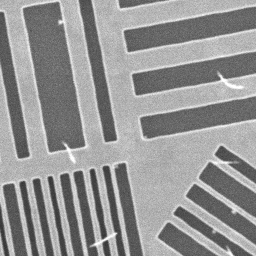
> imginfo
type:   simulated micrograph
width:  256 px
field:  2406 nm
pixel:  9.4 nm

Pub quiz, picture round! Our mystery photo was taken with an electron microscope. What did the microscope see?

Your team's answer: groups of lines, slits or small figures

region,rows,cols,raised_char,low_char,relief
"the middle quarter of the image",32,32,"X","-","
--XXXXX---XXXXXXXXXXXXXXXXX-----
--XXXXX---XXXXXXXXXXXX----------
--XXXXX----XXXXXX---------------
--XXXXX----XXXXXX---------------
--XXXXX----XXXXXX---------------
---XXXXX---XXXXXX---------------
---XXXXX---XXXXXXX---------XXXXX
---XXXXX---XXXXXXX--XXXXXXXXXXXX
---XXXXX---XXXXXXXXXXXXXXXXXXXXX
---XXXXX----XXXXXXXXXXXXXXXXXXXX
----XXXX----XXXXXXXXXXXXXXXXXXXX
----XXXXX---XXXXXXXXXXXXXXXXX---
----XXXXX---XXXXXXXXXXX---------
----XXXXX---XXXXXXX-------------
----XXXXX----XXXXXX-------------
-----XXXX----XXXXXX-------------
-----XXXXX---XXXXXXX------------
-----XXXXX---XXXXXXX-------XXXXX
-----XXXXX---XXXXXXX--XXXXXXXXXX
-----XXXXXXXXXXXXXXXXXXXXXXXXXXX
-----XXXXXXXXXXXXXXXXXXXXXXXXXXX
XXXXXXXXXXXXXXXXXXXXXXXXXXXXXXXX
XXXXXXXXXXXXXXXXXXXXXXXXXXXXXXXX
XXXXXXXXXXXXXXXXXXXXXXXXXXXXXXXX
XXXXXXXXXXXXXXXXXXXXXXXXXXXXXXXX
XXXXXXXXXX-XX---XXXXXXXXXXXXXXXX
XXXXXX--XX-XX---XXXXXXXXXXXXXXXX
-X---X--XX--X---XXXXXXXXXXXXXXXX
-X---XX-XX--X---XXXXXXXXXXXXXXXX
--X--XX-XX--X---XXXXXXXXXXXXXXXX
--X--XX--X--X----XXXXXXXXXXXXXXX
--X---X--X--X----XXXXXXXXXXXXXX-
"